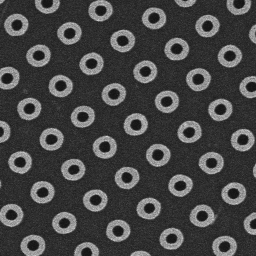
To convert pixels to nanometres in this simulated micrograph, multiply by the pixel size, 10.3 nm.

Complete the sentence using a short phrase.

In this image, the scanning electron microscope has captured a regular array of ring-shaped raised bodies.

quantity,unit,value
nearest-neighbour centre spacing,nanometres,388